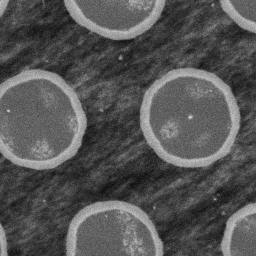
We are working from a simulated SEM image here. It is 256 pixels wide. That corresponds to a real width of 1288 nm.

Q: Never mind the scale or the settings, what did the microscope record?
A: raised bodies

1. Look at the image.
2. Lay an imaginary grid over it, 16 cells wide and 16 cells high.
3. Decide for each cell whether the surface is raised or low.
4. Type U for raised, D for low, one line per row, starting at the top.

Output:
DDDDDUUUUUDDDDUU
DDDDDUUUUDDDDDDU
DDDDDDDDDDDDDDDD
DDDDDDDDDDDDDDDD
DDDDDDDDDDDUDDDD
UUUUDDDDDDUUUUDD
UUUUUDDDDUUUUUUD
UUUUUDDDDUUUUUUD
UUUUUDDDDUUUUUUD
UUUUDDDDDDUUUUDD
DDDDDDDDDDDDDDDD
DDDDDDDDDDDDDDDD
DDDDDDDDDDDDDDDD
DDDDDUUUUDDDDDDU
DDDDUUUUUUDDDDUU
DDDDUUUUUUDDDDUU